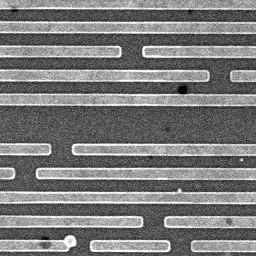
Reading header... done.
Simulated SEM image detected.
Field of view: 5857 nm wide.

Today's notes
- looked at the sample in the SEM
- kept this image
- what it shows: groups of lines, slits or small figures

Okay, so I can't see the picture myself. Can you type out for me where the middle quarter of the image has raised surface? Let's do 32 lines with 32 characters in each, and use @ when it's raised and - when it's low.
--------------------------------
--------------------------------
@@@@@@@@@@@@@@@@@@@@@@@@@@@@@@@@
@@@@@@@@@@@@@@@@@@@@@@@@@@@@@@@@
--------------------------------
--------------------------------
--------------------------------
--------------------------------
@@@@@@@@@@@@@@@@@@@@@@@@@@@@@@@@
@@@@@@@@@@@@@@@@@@@@@@@@@@@@@@@@
--------------------------------
--------------------------------
--------------------------------
--------------------------------
--------------------------------
--------------------------------
--------------------------------
--------------------------------
--------------------------------
--------------------------------
--@@@@@@@@@@@@@@@@@@@@@@@@@@@@@@
--@@@@@@@@@@@@@@@@@@@@@@@@@@@@@@
---@@@@@@@@@@@@@@@@@@@@@@@@@@@@@
--------------------------------
--------------------------------
--------------------------------
@@@@@@@@@@@@@@@@@@@@@@@@@@@@@@@@
@@@@@@@@@@@@@@@@@@@@@@@@@@@@@@@@
@@@@@@@@@@@@@@@@@@@@@@@@@@@@@@@@
--------------------------------
--------------------------------
--------------------------------